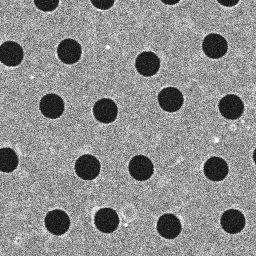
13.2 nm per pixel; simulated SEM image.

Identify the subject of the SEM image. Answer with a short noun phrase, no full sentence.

a regular array of holes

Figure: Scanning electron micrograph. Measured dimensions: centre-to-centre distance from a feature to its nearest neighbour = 705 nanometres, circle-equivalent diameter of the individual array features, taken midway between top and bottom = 342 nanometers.